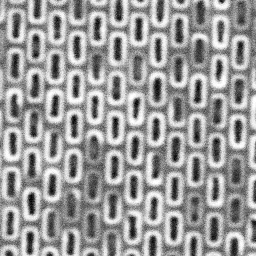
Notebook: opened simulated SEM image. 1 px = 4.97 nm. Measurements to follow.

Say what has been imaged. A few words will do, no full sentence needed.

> a regular array of holes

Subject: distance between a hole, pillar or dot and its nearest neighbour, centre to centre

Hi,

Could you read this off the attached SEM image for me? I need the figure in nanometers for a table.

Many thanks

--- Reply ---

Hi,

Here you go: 138